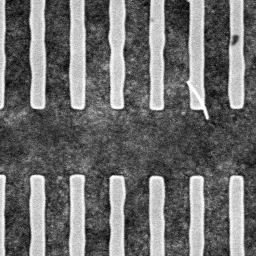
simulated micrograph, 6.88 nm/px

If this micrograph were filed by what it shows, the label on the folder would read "groups of lines, slits or small figures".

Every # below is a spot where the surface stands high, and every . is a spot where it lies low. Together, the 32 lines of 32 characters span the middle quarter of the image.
..###.......###.......###.......
.####.......###.......###.......
.####.......###.......###.......
.####.......###.......###.......
..###.......###.......###......#
..###.......###.......###......#
..###.......##........###.......
..###.......###.......###.......
..###.......###.......###.......
..###.......###.......###.......
..###.......###.......###.......
................................
................................
................................
................................
................................
................................
................................
................................
................................
................................
................................
................................
................................
................................
................................
................................
................................
..###.......###.......##........
..###.......###......####.......
..###.......###......####.......
..###.......###.......###.......